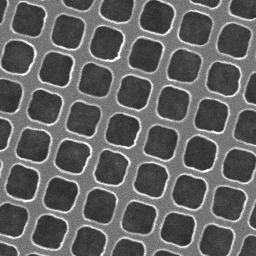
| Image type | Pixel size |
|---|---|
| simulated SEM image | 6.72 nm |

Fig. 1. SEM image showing a regular array of holes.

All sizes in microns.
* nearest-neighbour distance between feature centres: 0.264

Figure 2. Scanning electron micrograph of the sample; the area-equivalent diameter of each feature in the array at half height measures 225 nanometers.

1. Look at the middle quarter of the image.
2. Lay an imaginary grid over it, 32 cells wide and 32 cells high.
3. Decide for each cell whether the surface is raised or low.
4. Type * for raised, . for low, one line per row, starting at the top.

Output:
..***....********.......**......
..***......********....***......
.***........**************......
.***........***....*******......
.***........**.......********.*.
****........**........**********
****.......***........**.....***
*****......**........***.......*
*************........**........*
***.**********.......**........*
**......*******.....***........*
**.......*********.****........*
*........****.**********......**
*........***.....********.....**
*........**........*************
*.......***........***..********
*.......***........**......*****
***....***........***.......****
**********........***........***
...********.......**........***.
......********...***........***.
.......***.*********........**..
.......**.....*******......***..
......***......*********...***..
.....****.......**************..
.....***........***.....*******.
.....***........**........******
********.......***........******
********.......***........**....
..*******.....***.........**....
...***************.......***....
....***...********.......**.....